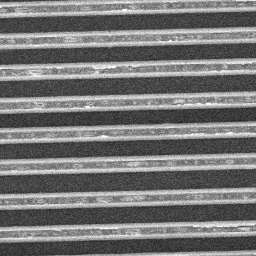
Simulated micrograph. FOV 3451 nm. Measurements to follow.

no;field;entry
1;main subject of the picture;parallel lines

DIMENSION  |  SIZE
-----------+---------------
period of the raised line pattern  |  433 nanometres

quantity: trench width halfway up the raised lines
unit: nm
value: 256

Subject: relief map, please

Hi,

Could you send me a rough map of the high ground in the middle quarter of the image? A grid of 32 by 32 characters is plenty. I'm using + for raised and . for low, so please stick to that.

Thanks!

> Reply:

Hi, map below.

++++++++++++++++++++++++++++++++
++++++++++++++++++++++++++++++++
+++++++++++++++++++++++++++.....
................................
................................
................................
................................
................................
......++++++++++++++++++++++++++
++++++++++++++++++++++++++++++++
++++++++++++++++++++++++++++++++
++++............................
................................
................................
................................
........................++++++++
++++++++++++++++++++++++++++++++
++++++++++++++++++++++++++++++++
+++++++++++++++++++++...........
................................
................................
................................
................................
....................++++++++++++
++++++++++++++++++++++++++++++++
++++++++++++++++++++++++++++++++
++++++++++++++++++..............
................................
................................
................................
................................
................................